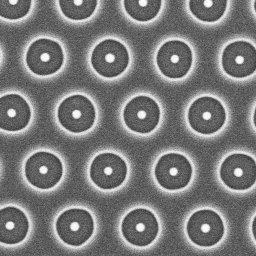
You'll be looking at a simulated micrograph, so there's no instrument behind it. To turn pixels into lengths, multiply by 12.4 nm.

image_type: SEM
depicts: an array of small figures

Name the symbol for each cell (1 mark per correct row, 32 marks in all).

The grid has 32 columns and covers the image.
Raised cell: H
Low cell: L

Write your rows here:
LLLLHHHLLLLLHHHLLLLLHHHLLLLLHHHH
LLLLHHHHLLLLHHHHLLLLHHHHLLLLHHHH
HLHHHHHHHLHHHHHHHLLHHHHHHLLHHHHH
HHHHHHHHHHHHHHHHHHHHHHHHHHHHHHHH
HHHHHHHHHHHHHHHHHHHHHHHHHHHHHHHH
HHHHLLLHHHHHLLLHHHHHLLLHHHHHLLLH
HHHLLLLLHHHLLLLLHHHHLLLLHHHHLLLL
HHHLLLLLHHHLLLLLHHHLLLLLHHHHLLLL
HHHHLLLLHHHHLLLLHHHHLLLLHHHHLLLL
HHHHHLHHHHHHHLLHHHHHHLLHHHHHHLLH
HHHHHHHHHHHHHHHHHHHHHHHHHHHHHHHH
HHHHHHHHHHHHHHHHHHHHHHHHHHHHHHHH
LLLHHHHHLLLHHHHHLLLHHHHHLLLHHHHH
LLLLHHHLLLLLHHHLLLLLHHHHLLLLHHHH
LLLLHHHLLLLLHHHLLLLLHHHLLLLLHHHH
LLLLHHHLLLLLHHHHLLLLHHHHLLLLHHHH
HLHHHHHHHLLHHHHHHLLHHHHHLLLHHHHH
HHHHHHHHHHHHHHHHHHHHHHHHHHHHHHHH
HHHHHHHHHHHHHHHHHHHHHHHHHHHHHHHH
HHHHLLLHHHHHLLLHHHHHLLLHHHHHLLLH
HHHLLLLLHHHLLLLLHHHLLLLLHHHHLLLL
HHHLLLLLHHHLLLLLHHHLLLLLHHHLLLLL
HHHLLLLLHHHLLLLLHHHLLLLLHHHHLLLL
HHHHHLHHHHHHLLLHHHHHLLLHHHHHHLLH
HHHHHHHHHHHHHHHHHHHHHHHHHHHHHHHH
HHHHHHHHHHHHHHHHHHHHHHHHHHHHHHHH
LLLHHHHHLLLHHHHHLLLHHHHHLLLHHHHH
LLLLHHHLLLLLHHHLLLLLHHHLLLLLHHHL
LLLLHHHLLLLLHHHLLLLLHHHLLLLLHHHL
LLLHHHHLLLLHHHHLLLLLHHHLLLLLHHHH
LLHHHHHHLLHHHHHHLLLHHHHHLLLHHHHH
HHHHHHHHHHHHHHHHHHHHHHHHHHHHHHHH